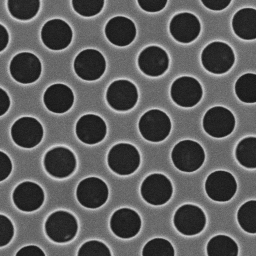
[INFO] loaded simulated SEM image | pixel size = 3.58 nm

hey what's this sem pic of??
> a regular array of holes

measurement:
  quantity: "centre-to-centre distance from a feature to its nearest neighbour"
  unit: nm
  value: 160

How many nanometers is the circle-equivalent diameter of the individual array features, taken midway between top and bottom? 114